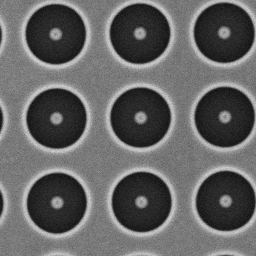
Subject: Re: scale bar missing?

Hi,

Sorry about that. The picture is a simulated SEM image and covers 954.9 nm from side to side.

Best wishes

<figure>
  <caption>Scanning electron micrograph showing an array of small figures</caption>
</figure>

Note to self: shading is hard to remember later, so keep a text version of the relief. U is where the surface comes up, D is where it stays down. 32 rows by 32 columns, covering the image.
UUUUUUDDUUUUUUUUDDDUUUUUUUDDDDUU
UUUUDDDDDDUUUUUDDDDDUUUUUDDDDDDU
UUUDDDDDDDDUUUDDDDDDDUUUDDDDDDDD
UUUDDDDDDDDUUUDDDDDDDUUUDDDDDDDD
UUUDDDDDDDDUUDDDDUDDDUUUDDDDDDDD
UUUDDDDDDDDUUUDDDDDDDUUUDDDDDDDD
UUUUDDDDDDUUUUDDDDDDDUUUUDDDDDDU
UUUUUDDDDUUUUUUDDDDDUUUUUUDDDDUU
UUUUUUUUUUUUUUUUUUUUUUUUUUUUUUUU
UUUUUUUUUUUUUUUUUUUUUUUUUUUUUUUU
UUUUUUUUUUUUUUUUUUUUUUUUUUUUUUUU
UUUUUDDDDUUUUUUDDDDDUUUUUUDDDDDU
UUUUDDDDDDUUUUDDDDDDDUUUUDDDDDDU
UUUDDDDDDDDUUUDDDDDDDUUUDDDDDDDD
DUUDDDDDDDDUUUDDDUDDDDUUDDDDDDDD
DUUDDDDDDDDUUUDDDDDDDUUUDDDDDDDD
UUUUDDDDDDDUUUDDDDDDDUUUUDDDDDDD
UUUUDDDDDDUUUUUDDDDDUUUUUDDDDDDU
UUUUUUDDUUUUUUUUDDDUUUUUUUUDDUUU
UUUUUUUUUUUUUUUUUUUUUUUUUUUUUUUU
UUUUUUUUUUUUUUUUUUUUUUUUUUUUUUUU
UUUUUUDDUUUUUUUUUDDUUUUUUUUDDDUU
UUUUDDDDDDUUUUUDDDDDDUUUUDDDDDDU
UUUUDDDDDDDUUUDDDDDDDUUUUDDDDDDD
UUUDDDDDDDDUUUDDDDDDDDUUDDDDDDDD
DUUDDDDDDDDUUUDDDUDDDDUUDDDDDDDD
UUUDDDDDDDDUUUDDDDDDDUUUDDDDDDDD
UUUUDDDDDDUUUUDDDDDDDUUUUDDDDDDU
UUUUUDDDDUUUUUUDDDDDUUUUUUDDDDUU
UUUUUUUUUUUUUUUUUUUUUUUUUUUUUUUU
UUUUUUUUUUUUUUUUUUUUUUUUUUUUUUUU
UUUUUUUUUUUUUUUUUUUUUUUUUUUUUUUU